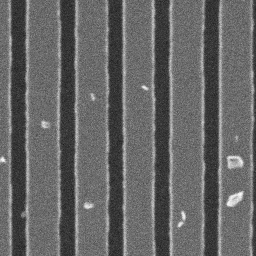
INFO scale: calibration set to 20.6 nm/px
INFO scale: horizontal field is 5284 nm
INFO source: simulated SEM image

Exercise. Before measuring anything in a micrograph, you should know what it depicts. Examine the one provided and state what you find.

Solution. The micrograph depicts lines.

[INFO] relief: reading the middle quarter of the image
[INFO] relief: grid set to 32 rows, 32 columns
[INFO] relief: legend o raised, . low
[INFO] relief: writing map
...oooooooo....ooooooo....oooooo
...oooooooo....ooooooo....oooooo
...oooooooo....ooooooo....oooooo
...oooooooo....ooooooo.....ooooo
...oooooooo....ooooooo.....ooooo
...oooooooo....ooooooo.....ooooo
...oooooooo....ooooooo.....ooooo
...oooooooo....ooooooo.....ooooo
...oooooooo....oooooooo....ooooo
...oooooooo....oooooooo....ooooo
...oooooooo....oooooooo....ooooo
...oooooooo....oooooooo....ooooo
...oooooooo....ooooooo.....ooooo
...oooooooo....ooooooo.....ooooo
...oooooooo....ooooooo.....ooooo
...oooooooo....oooooooo....ooooo
...oooooooo....oooooooo....ooooo
...oooooooo....ooooooo.....ooooo
...oooooooo....ooooooo.....ooooo
...oooooooo....ooooooo....oooooo
...oooooooo....ooooooo.....ooooo
...oooooooo....oooooooo...oooooo
...oooooooo....oooooooo....ooooo
...oooooooo....oooooooo....ooooo
...oooooooo....oooooooo....ooooo
...oooooooo....ooooooo.....ooooo
...oooooooo....ooooooo.....ooooo
...oooooooo....ooooooo.....ooooo
...oooooooo....ooooooo.....ooooo
...oooooooo....ooooooo.....ooooo
...oooooooo....ooooooo.....ooooo
...oooooooo....ooooooo.....ooooo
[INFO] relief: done